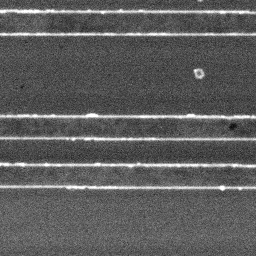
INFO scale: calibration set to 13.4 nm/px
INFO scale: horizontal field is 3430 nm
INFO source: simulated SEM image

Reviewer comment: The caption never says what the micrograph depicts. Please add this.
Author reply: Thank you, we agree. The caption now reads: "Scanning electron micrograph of lines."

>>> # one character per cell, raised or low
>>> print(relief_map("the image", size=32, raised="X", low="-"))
--------------------------------
XXXXXXXXXXXXXXXXXXXXXXXXXXXXXXXX
XXXXXXXXXXXXXXXXXXXXXXXXXXXXXXXX
XXXXXXXXXXXXXXXXXXXXXXXXXXXXXXXX
--------------------------------
--------------------------------
--------------------------------
--------------------------------
--------------------------------
--------------------------------
--------------------------------
--------------------------------
--------------------------------
--------------------------------
---XX---------------------------
XXXXXXXXXXXXXXXXXXXXXXXXXXXXXXXX
XXXXXXXXXXXXXXXXXXXXXXXXXXXXXXXX
--------------------------------
--------------------------------
--------------------------------
XXX--X------X----X--------------
XXXXXXXXXXXXXXXXXXXXXXXXXXXXXXXX
XXXXXXXXXXXXXXXXXXXXXXXXXXXXXXXX
---------------------------XX-X-
--------------------------------
--------------------------------
--------------------------------
--------------------------------
--------------------------------
--------------------------------
--------------------------------
--------------------------------